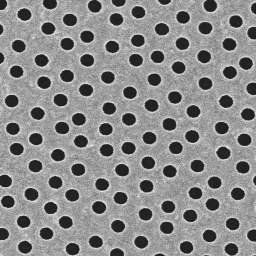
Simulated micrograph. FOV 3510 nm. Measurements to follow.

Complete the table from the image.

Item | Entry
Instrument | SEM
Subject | a regular array of holes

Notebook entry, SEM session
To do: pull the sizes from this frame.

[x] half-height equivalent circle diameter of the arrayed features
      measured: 185 nm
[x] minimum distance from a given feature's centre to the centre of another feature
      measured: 321 nm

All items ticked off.